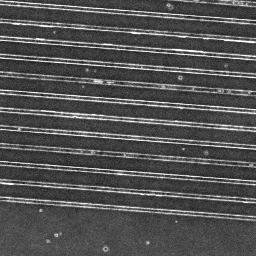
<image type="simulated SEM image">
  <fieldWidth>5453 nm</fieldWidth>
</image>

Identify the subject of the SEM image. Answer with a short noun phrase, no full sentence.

parallel lines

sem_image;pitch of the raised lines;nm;379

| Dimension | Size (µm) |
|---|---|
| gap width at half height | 0.3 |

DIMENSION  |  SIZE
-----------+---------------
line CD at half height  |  77 nm